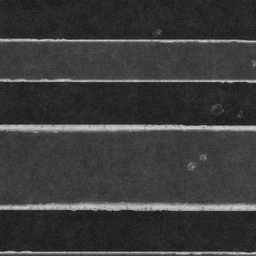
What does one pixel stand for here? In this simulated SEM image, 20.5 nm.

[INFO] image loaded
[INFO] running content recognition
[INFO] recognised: lines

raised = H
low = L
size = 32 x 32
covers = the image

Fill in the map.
LLLLLLLLLLLLLLLLLLLLLLLLLLLLLLLL
LLLLLLLLLLLLLLLLLLLLLLLLLLLLLLLL
LLLLLLLLLLLLLLLLLLLLLLLLLLLLLLLL
LLLLLLLLLLLLLLLLLLLLLLLLLLLLLLLL
LLLLLLLLLLLLLLLLLLLLLLLLLLLLLLLL
HHHHHHHHHHHHHHHHHHHHHHHHHHHHHHHH
HHHHHHHHHHHHHHHHHHHHHHHHHHHHHHHH
HHHHHHHHHHHHHHHHHHHHHHHHHHHHHHHH
HHHHHHHHHHHHHHHHHHHHHHHHHHHHHHHH
HHHHHHHHHHHHHHHHHHHHHHHHHHHHHHHH
LLLLLLLLLLLLLLLLLLLLLLLLLLLLLLLL
LLLLLLLLLLLLLLLLLLLLLLLLLLLLLLLL
LLLLLLLLLLLLLLLLLLLLLLLLLLLLLLLL
LLLLLLLLLLLLLLLLLLLLLLLLLLLLLLLL
LLLLLLLLLLLLLLLLLLLLLLLLLLLLLLLL
LLLLLLLLLLLLLLLLLLLLLLLLLLLLLLLL
HHHHHHHHHHHHHHHHHHHHHHHHHHHHHHHH
HHHHHHHHHHHHHHHHHHHHHHHHHHHHHHHH
HHHHHHHHHHHHHHHHHHHHHHHHHHHHHHHH
HHHHHHHHHHHHHHHHHHHHHHHHHHHHHHHH
HHHHHHHHHHHHHHHHHHHHHHHHHHHHHHHH
HHHHHHHHHHHHHHHHHHHHHHHHHHHHHHHH
HHHHHHHHHHHHHHHHHHHHHHHHHHHHHHHH
HHHHHHHHHHHHHHHHHHHHHHHHHHHHHHHH
HHHHHHHHHHHHHHHHHHHHHHHHHHHHHHHH
HHHHHHHHHHHHHHHHHHHHHHHHHHHHHHHH
LLLLLLLLLLLLLLLLLLLLLLLLLLLLLLLL
LLLLLLLLLLLLLLLLLLLLLLLLLLLLLLLL
LLLLLLLLLLLLLLLLLLLLLLLLLLLLLLLL
LLLLLLLLLLLLLLLLLLLLLLLLLLLLLLLL
LLLLLLLLLLLLLLLLLLLLLLLLLLLLLLLL
LLLLLLLLLLLLLLLLLLLLLLLLLLLLLLLL